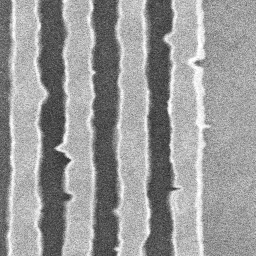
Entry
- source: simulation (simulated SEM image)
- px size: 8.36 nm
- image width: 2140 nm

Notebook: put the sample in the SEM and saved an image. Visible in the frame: parallel lines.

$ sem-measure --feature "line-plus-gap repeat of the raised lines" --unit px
53.5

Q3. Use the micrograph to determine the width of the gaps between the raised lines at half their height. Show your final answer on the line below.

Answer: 200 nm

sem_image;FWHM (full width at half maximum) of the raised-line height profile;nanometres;245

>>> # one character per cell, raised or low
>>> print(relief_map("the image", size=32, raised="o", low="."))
..ooo...oooo...ooo...oooo.......
..ooo...oooo...ooo....ooo.......
.oooo...ooo....ooo....ooo.......
.oooo...oooo..oooo....ooo.......
..ooo...oooo...ooo...oooo.......
..ooo...oooo...ooo...oooo.......
.oooo...oooo...ooo...oooo.......
.oooo...oooo...ooo...oooo.......
.oooo...oooo...ooo...oooo.......
.oooo...oooo...ooo...oooo.......
..ooo...oooo...ooo...oooo.......
.ooooo..oooo...oooo..oooo.......
.ooooo..oooo...oooo..oooo.......
.oooo...oooo...oooo..oooo.......
.oooo...oooo...ooo...oooo.......
.oooo...oooo...ooo...oooo.......
.oooo...oooo...ooo...oooo.......
.oooo...oooo...oooo..oooo.......
.oooo..ooooo...oooo..oooo.......
.oooo...oooo...oooo..oooo.......
.oooo....ooo...oooo..oooo.......
..ooo...oooo...oooo...ooo.......
.oooo...oooo...ooo....ooo.......
.oooo...oooo...ooo....ooo.......
.oooo....ooo...ooo...oooo.......
.oooo...oooo...oooo..oooo.......
.oooo...oooo..ooooo..oooo.......
.oooo...oooo...oooo...ooo.......
.oooo...oooo...oooo...ooo.......
.oooo...oooo...oooo..oooo.......
.oooo...ooo....ooo....ooo.......
.oooo...ooo....ooo....ooo.......